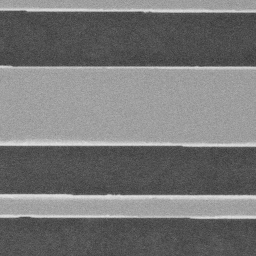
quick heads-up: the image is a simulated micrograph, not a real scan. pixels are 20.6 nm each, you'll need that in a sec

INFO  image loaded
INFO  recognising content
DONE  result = lines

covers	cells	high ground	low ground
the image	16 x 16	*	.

****************
................
................
................
****************
****************
****************
****************
****************
................
................
................
****************
...*************
................
................